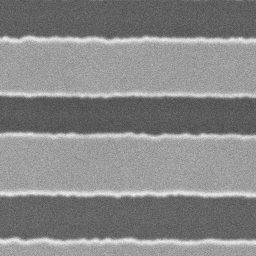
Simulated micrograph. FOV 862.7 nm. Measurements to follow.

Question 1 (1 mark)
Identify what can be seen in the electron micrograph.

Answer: lines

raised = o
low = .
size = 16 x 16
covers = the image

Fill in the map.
................
................
oooooooooooooooo
oooooooooooooooo
oooooooooooooooo
oooooooooooooooo
................
................
ooooooooo.ooooo.
oooooooooooooooo
oooooooooooooooo
oooooooooooooooo
................
................
................
oooooooooooooooo